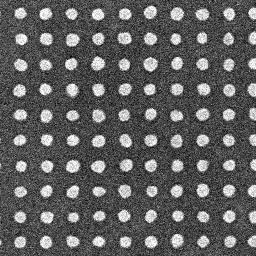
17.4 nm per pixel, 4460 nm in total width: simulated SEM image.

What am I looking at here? a regular array of raised bodies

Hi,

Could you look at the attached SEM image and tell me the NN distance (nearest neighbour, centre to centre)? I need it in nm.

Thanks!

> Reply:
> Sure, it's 433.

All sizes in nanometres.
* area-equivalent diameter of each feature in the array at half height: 209